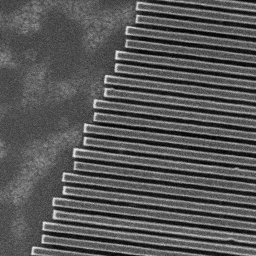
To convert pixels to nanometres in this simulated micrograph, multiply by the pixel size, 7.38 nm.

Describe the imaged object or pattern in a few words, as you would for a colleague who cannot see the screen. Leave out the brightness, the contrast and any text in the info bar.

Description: parallel lines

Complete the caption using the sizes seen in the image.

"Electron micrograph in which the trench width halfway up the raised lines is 37.5 nanometres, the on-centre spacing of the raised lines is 0.0944 µm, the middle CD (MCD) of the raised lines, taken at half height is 56.8 nanometers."